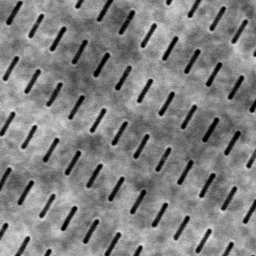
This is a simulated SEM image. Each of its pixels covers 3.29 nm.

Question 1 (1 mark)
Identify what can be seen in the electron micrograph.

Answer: a regular array of holes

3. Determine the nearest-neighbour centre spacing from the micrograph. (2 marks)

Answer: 83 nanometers